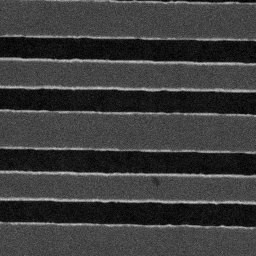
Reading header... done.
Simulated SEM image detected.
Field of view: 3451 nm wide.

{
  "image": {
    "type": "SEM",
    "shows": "lines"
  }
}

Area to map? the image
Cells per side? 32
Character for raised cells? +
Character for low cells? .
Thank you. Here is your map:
++++++++++++++++++++++++++++++++
++++++++++++++++++++++++++++++++
++++++++++++++++++++++++++++++++
++++++++++++++++++++++++++++++++
++++++++++++++++++++++++++++++++
................................
................................
+++++++.........................
++++++++++++++++++++++++++++++++
++++++++++++++++++++++++++++++++
++++++++++++++++++++++++++++++++
................................
................................
................................
++++++++++++++++++++++++++++++++
++++++++++++++++++++++++++++++++
++++++++++++++++++++++++++++++++
++++++++++++++++++++++++++++++++
++++++++++++++++++++++++++++++++
................................
................................
+++.............................
++++++++++++++++++++++++++++++++
++++++++++++++++++++++++++++++++
++++++++++++++++++++++++++++++++
................................
................................
................................
++++++++++++++++++++++++++++++++
++++++++++++++++++++++++++++++++
++++++++++++++++++++++++++++++++
++++++++++++++++++++++++++++++++